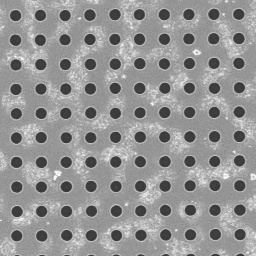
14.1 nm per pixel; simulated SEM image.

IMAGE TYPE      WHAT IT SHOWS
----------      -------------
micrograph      a regular array of holes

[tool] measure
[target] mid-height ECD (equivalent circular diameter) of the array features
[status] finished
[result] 160 nm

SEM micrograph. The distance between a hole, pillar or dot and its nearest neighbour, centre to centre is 342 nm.